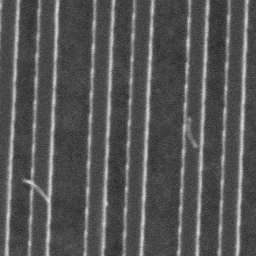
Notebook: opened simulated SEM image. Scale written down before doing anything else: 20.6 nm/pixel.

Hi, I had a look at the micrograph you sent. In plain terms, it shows lines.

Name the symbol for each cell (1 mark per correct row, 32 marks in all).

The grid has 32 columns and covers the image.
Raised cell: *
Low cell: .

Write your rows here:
**...**.....**...**.....**...**.
**...**.....**...**.....**...**.
**...**.....**...**.....**...**.
**...**.....**...**.....**...**.
**...**.....**...**.....**..***.
**...**.....**...**....***..***.
**...**.....**...**....***..***.
**...**.....**..***....***..***.
**...**.....**..***....***..***.
**..***.....**..***....***..**..
**..***.....**..***....***..**..
**..***....***..***....***..**..
**..***....***..***....**...**..
**..***....***..***....**...**..
**..***....***..***....**...**..
**..***....***..**.....**...**..
**..***....***..**.....**...**..
*...***....**...**.....**...**..
*...***....**...**.....**...**..
*...**.....**...**.....**...**..
*...**.....**...**.....**...**..
*...**.....**...**.....**...**..
*...**.....**...**.....**...**..
*...**.....**...**.....**...**..
*...**.....**...**.....**...**..
*...**.....**...**.....**...**..
*...**.....**...**.....**...**..
*...**.....**...**.....**...**..
*...**.....**...**....***...**..
*...**.....**...**....***...**..
*...**.....**...**....***...**..
*...**.....**..***....***..***..